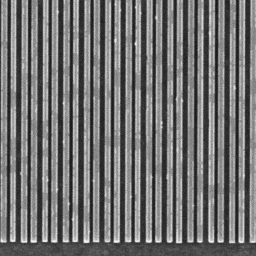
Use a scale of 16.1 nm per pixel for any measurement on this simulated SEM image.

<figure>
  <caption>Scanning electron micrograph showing parallel lines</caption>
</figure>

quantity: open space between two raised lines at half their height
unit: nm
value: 78.4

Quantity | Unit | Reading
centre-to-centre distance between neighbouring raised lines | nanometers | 166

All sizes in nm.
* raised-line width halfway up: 92.4